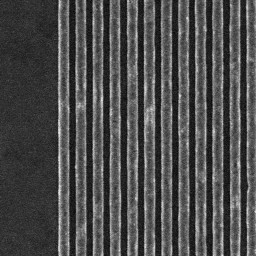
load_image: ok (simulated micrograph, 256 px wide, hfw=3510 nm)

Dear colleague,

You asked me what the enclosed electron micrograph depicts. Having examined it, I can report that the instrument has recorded parallel lines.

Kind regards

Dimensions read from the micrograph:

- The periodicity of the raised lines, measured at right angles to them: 17.1 pixels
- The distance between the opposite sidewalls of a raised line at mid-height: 132 nanometers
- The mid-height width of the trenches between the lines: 95.9 nanometers